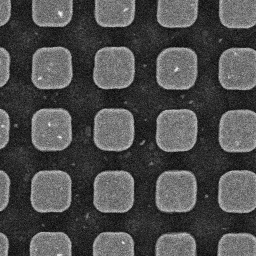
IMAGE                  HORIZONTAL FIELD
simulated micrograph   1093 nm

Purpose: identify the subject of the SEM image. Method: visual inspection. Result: a regular array of raised bodies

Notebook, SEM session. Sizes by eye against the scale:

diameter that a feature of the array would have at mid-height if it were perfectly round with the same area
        44.3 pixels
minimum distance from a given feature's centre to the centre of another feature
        263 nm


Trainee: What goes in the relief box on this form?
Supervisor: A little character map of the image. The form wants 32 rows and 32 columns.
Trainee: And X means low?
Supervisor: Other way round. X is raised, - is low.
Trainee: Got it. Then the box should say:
X---XXXXX---XXXXX---XXXXX--XXXXX
X---XXXXX---XXXXX---XXXXX--XXXXX
X---XXXXX---XXXXX---XXXX----XXXX
--------------------------------
--------------------------------
--------------------------------
X---XXXXX---XXXX----XXXX----XXXX
X---XXXXX---XXXXX---XXXXX--XXXXX
X---XXXXX---XXXXX---XXXXX--XXXXX
X---XXXXX---XXXXX---XXXXX--XXXXX
X---XXXXX---XXXX----XXXX----XXXX
--------------------------------
--------------------------------
--------------------------------
X---XXXXX---XXXXX---XXXX----XXXX
X---XXXXX---XXXXX---XXXXX--XXXXX
X---XXXXX---XXXXX---XXXXX--XXXXX
X---XXXXX---XXXXX---XXXXX--XXXXX
-----XXX----XXXX----XXXX----XXXX
--------------------------------
--------------------------------
-----XXX-----XXX-----XX------XXX
X---XXXXX---XXXXX---XXXXX--XXXXX
X---XXXXX---XXXXX---XXXXX--XXXXX
X---XXXXX---XXXXX--XXXXXX--XXXXX
X---XXXXX---XXXXX---XXXX---XXXXX
-----X----------------X------XX-
--------------------------------
--------------------------------
X---XXXX----XXXX----XXXX----XXXX
X---XXXXX---XXXXX---XXXX---XXXXX
X---XXXXX---XXXXX---XXXX---XXXXX